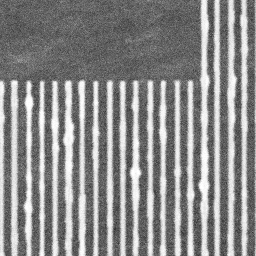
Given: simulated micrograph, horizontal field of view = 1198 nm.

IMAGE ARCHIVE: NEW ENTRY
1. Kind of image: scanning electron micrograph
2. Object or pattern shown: parallel lines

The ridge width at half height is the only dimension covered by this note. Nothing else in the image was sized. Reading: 0.0199 micrometres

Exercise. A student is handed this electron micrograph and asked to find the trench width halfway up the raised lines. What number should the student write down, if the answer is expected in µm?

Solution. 0.0404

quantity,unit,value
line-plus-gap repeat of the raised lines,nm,63